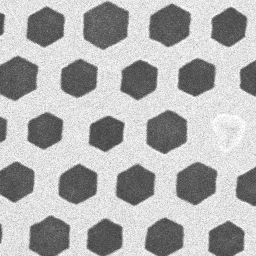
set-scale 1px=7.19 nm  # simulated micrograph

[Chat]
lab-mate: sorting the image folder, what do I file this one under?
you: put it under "a regular array of holes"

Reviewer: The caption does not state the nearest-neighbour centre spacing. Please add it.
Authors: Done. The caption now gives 422 nanometres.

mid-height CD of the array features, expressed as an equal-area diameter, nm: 276